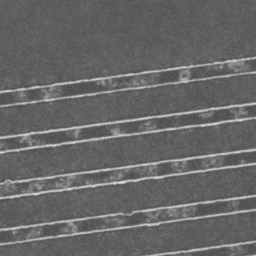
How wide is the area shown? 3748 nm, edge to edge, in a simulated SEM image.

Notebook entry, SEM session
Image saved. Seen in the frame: parallel lines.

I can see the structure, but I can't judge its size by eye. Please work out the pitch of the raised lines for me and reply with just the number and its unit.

667 nm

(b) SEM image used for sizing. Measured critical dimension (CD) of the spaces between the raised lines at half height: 452 nm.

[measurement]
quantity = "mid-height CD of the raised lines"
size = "218 nanometers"